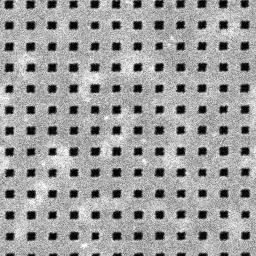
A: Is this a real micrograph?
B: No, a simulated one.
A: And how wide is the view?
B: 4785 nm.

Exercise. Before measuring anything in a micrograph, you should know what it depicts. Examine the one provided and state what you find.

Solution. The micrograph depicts a regular array of holes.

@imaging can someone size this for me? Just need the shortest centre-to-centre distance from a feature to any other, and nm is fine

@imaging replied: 393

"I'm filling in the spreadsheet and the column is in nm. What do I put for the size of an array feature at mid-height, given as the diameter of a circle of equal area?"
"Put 183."